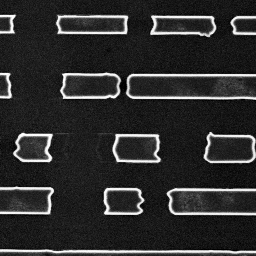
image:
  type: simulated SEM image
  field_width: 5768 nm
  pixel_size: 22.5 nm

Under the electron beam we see parallel lines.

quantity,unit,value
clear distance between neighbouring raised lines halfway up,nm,842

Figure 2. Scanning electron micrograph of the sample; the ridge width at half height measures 541 nm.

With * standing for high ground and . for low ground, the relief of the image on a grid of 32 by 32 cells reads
................................
................................
**.....*********...********..***
**.....*********...********..***
................................
................................
................................
................................
................................
*.......*******.****************
*.......*******.****************
*.......*******.****************
................................
................................
................................
................................
................................
..****........******......******
..****........******......******
..****........******......******
................................
................................
................................
................................
******.......*****...***********
******.......*****...***********
******.......****.....**********
................................
................................
................................
................................
***************...**************